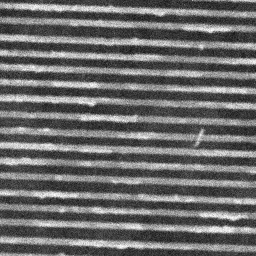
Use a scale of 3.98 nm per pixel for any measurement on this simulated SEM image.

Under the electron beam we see parallel lines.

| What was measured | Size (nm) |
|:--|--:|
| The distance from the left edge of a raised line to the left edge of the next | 62.1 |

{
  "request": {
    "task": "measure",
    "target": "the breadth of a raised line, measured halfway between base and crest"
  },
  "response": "19.9 nanometres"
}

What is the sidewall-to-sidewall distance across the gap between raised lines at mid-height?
40.2 nm